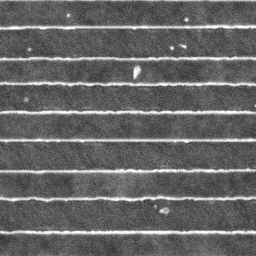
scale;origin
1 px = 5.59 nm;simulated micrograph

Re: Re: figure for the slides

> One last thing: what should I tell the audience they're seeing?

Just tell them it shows lines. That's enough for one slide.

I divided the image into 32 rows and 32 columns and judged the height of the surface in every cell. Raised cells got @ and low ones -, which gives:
@@@@@@@@@@@@@@@@@@@@@@@@@@@@@@@@
@@@@@@@@@@@@@@@@@@@@@@@@@@@@@@@@
@@@@@@@@@@@@@@@@@@@@@@@@@@@@@@@@
@@@--@-@@@------@---------------
--------------------------------
--------------------------------
--------------------------------
@@@@@@@@@@@@@@@@@@@@@@@@@@@@@@@@
@@@@@@@@@@@@@@@@@@@@@@@@@@@@@@@@
@@@@@@@@@@@@@@@@@@@@@@@@@@@@@@@@
--------@-@@@@@@@@@@@@@@@@--@@-@
--------------------------------
--------------------------------
--------------------------------
@@@@@@@@@@@@@@@@@@@@@@@@@@@@@@@@
@@@@@@@@@@@@@@@@@@@@@@@@@@@@@@@@
@@@@@@@@@@@@@@@@@@@@@@@@@@@@@@@@
@@@@@@@@@@@@@@@@@@@@@@@@@@@@@@@@
--------------------------------
--------------------------------
--------------------------------
@@@@@@@@@@@@@@@@@@@@@@@@@@@@@@@@
@@@@@@@@@@@@@@@@@@@@@@@@@@@@@@@@
@@@@@@@@@@@@@@@@@@@@@@@@@@@@@@@@
@@@@@@@@@@@@@@@@@@@@@@@@@@@@@@@@
--------------------------------
--------------------------------
--------------------------------
--------------------------------
@@@@@@@@@@@@@@@@@@@@@@@@@@@@@@@@
@@@@@@@@@@@@@@@@@@@@@@@@@@@@@@@@
@@@@@@@@@@@@@@@@@@@@@@@@@@@@@@@@